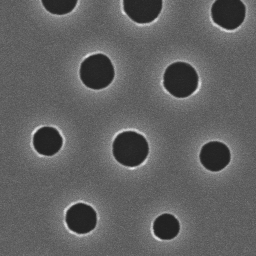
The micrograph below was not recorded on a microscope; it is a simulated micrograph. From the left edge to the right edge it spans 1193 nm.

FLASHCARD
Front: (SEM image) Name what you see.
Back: holes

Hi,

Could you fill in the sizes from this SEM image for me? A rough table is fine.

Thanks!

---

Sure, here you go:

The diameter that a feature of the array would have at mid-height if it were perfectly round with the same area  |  143 nanometers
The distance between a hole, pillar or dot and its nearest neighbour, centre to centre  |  390 nm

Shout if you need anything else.